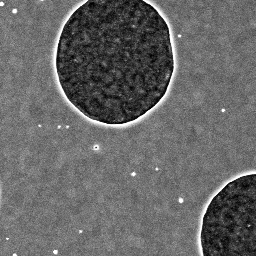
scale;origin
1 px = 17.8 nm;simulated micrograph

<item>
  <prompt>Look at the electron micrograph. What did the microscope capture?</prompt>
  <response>holes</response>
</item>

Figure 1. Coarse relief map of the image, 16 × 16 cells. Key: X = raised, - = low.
XXXXX-----XXXXXX
XXXX------XXXXXX
XXXX-------XXXXX
XXXX-------XXXXX
XXXX-------XXXXX
XXXX------XXXXXX
XXXXX-----XXXXXX
XXXXXX--XXXXXXXX
XXXXXXXXXXXXXXXX
XXXXXXXXXXXXXXXX
XXXXXXXXXXXXXXXX
XXXXXXXXXXXXXX--
XXXXXXXXXXXXX---
XXXXXXXXXXXXX---
XXXXXXXXXXXXX---
XXXXXXXXXXXXX---